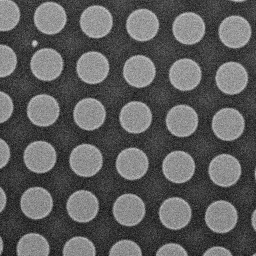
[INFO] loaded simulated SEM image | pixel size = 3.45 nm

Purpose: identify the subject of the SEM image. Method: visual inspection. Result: an array of small figures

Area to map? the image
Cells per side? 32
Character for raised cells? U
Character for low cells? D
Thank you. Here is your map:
UUDDDUUDDDDDDDDDDDDDDDDDDDDDDDDD
UUDDDUUUDDDUUUDDDUUDDDDDDDDDDDDD
UUDDUUUUDDUUUUDDUUUUDDUUUDDDUUUD
UDDDDUUUDDUUUUDDUUUUDDUUUUDUUUUD
DDDDDDDDDDDUUDDDUUUDDDUUUDDUUUUD
DDDDDDDDDDDDDDDDDDDDDDDDDDDDUUUD
UUDDDUUDDDDDDDDDDDDDDDDDDDDDDDDD
UUDDUUUUDDUUUDDDUUUDDDDUDDDDDDDD
UUDDUUUUDDUUUUDUUUUDDUUUUDDDUUDD
UDDDDUUDDDUUUDDDUUUDDUUUUDDUUUUD
DDDDDDDDDDDDDDDDUUUDDDUUUDDUUUUD
DDDDDDDDDDDDDDDDDDDDDDDDDDDDUUDD
UDDDUUUDDDUUDDDDDDDDDDDDDDDDDDDD
UUDDUUUDDUUUUDDUUUDDDDUUDDDDDDDD
UDDDUUUDDUUUUDDUUUUDDUUUUDDUUUDD
DDDDUUDDDDUUUDDUUUUDDUUUUDDUUUDD
DDDDDDDDDDDDDDDDUUDDDUUUDDDUUUDD
DDDDDDDDDDDDDDDDDDDDDDDDDDDDDDDD
UDDUUUUDDDUUDDDDDDDDDDDDDDDDDDDD
UDDUUUUDDUUUUDDUUUDDDUUUDDDUUDDD
UDDUUUUDDUUUUDDUUUDDUUUUDDUUUUDD
DDDDUDDDDUUUDDDUUUDDDUUUDDUUUUDD
DDDDDDDDDDDDDDDDDDDDDUUDDDDUUUDD
DDDDUDDDDDDDDDDDDDDDDDDDDDDDDDDD
UDDUUUDDDUUUDDDUUDDDDDDDDDDDDDDD
UDDUUUDDUUUUDDUUUUDDUUUDDDDUUDDD
DDDUUUDDDUUUDDUUUUDDUUUUDDUUUDDD
DDDDDDDDDUUDDDDUUUDDUUUUDDUUUUDD
DDDDDDDDDDDDDDDDDDDDDUUDDDUUUDDD
DDDUUDDDDDDDDDDDDDDDDDDDDDDDDDDD
DDUUUUDDUUUDDDUUUDDDDDDDDDDDDDDD
DDUUUUDDUUUUDDUUUUDDUUUDDDUUUDDD